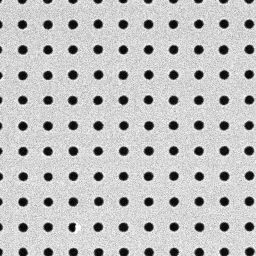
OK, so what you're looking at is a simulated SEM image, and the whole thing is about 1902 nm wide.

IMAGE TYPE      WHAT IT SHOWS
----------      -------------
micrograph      a regular array of holes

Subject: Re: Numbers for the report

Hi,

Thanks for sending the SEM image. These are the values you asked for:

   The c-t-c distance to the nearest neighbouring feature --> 184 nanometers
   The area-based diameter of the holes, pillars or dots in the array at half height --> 68.7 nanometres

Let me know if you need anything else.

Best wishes